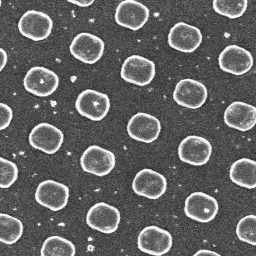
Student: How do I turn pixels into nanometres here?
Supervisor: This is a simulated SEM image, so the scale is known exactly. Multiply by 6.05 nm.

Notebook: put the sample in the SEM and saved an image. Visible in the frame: a regular array of raised bodies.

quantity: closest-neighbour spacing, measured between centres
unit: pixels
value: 55.9